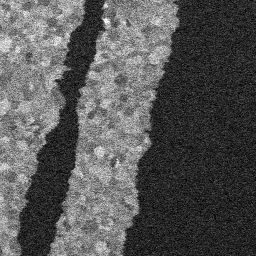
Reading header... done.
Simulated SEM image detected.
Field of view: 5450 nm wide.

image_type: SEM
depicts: one or a few lines or trenches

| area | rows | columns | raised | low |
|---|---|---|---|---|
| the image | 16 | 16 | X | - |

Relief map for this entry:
XXXXX--XXXX-----
XXXXX-XXXXX-----
XXXX--XXXXX-----
XXXX--XXXXX-----
XXXX--XXXX------
XXXX-XXXXX------
XXXX-XXXX-------
XXXX-XXXX-------
XXX--XXXX-------
XX---XXXX-------
XX---XXXX-------
XX--XXXX--------
XX--XXXXX-------
X---XXXX--------
X---XXXX--------
X--XXXXX--------